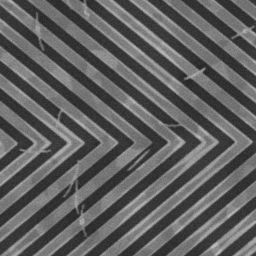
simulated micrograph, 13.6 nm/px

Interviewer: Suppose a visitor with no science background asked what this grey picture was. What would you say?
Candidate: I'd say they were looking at groups of lines, slits or small figures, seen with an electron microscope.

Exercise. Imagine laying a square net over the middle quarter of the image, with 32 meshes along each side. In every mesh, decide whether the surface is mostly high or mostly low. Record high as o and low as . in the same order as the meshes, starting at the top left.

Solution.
...oooo....oooo.....ooo.....oooo
....oooo.....ooo......ooo.....oo
o....oooo.....oooo.....ooo.....o
oo....ooooo....oooo.....ooo...oo
ooo....ooooo....oooo.....ooo....
ooooo....oooo.....ooo.....oooo..
..oooo....oooo.....ooo.....oooo.
...oooo....oooo.....oooo....oooo
....oooo.....oooo.....ooo.....oo
o....ooooo....oooo.....ooo.....o
ooo....oooo....oooo.....oooo....
oooo....oooo.....ooo.....oooo...
.oooo....oooo.....oooo....oooo..
..oooo....oooo.....oooo....oooo.
...oooo.....oooo....oooo.....ooo
.....ooo.....oooo....ooooo...ooo
o.....ooo.....oooo.....oooo....o
oo.....oooo....oooo.....oooo....
ooo.....oooo.....oooo....oooo...
.ooo.....oooo.....oooo....oooo..
.ooo.....oooo....oooo....oooo...
ooo....oooo.....oooo....oooo....
oo....oooo.....oooo....oooo.....
.....oooo....oooo.....oooo.....o
...ooooo....oooo....oooo.....ooo
...oooo....oooo....oooo.....ooo.
..oooo....oooo....oooo.....ooo..
oooo....ooooo....oooo....oooo...
ooo....ooooo....oooo....oooo....
oo....oooo....oooo.....oooo....o
o....oooo....oooo.....oooo....oo
...ooooo....oooo....oooo.....ooo